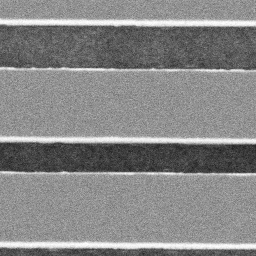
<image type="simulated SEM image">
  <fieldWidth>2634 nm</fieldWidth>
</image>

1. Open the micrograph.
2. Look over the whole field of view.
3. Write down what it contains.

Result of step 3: lines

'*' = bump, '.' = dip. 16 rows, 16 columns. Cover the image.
****************
.......*********
................
................
****************
****************
****************
****************
****************
................
................
****************
****************
****************
****************
................